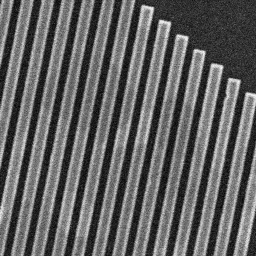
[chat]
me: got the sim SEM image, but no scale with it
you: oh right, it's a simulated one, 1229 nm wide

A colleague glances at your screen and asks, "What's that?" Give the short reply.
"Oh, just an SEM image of parallel lines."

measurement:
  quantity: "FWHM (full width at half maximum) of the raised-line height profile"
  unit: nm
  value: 49.4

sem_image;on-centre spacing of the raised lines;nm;95.1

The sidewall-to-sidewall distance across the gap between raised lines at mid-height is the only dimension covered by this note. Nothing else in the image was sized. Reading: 49.4 nanometres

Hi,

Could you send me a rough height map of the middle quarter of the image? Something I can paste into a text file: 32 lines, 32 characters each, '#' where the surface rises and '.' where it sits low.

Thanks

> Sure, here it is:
..##...##...##...##...##...##...
.###..###..###...##...##...##...
.###..###..###..###..###...##...
.##...###..###..###..###..###..#
.##...##...##...##...##...##...#
.##...##...##...##...##...##...#
###..###...##...##...##...##...#
###..###..###..###...##..###...#
##...###..###..###..###..###..##
##...##...##...##...##...##...##
##...##...##...##...##...##...##
##..###...##...##...##...##...##
##..###..###..###...##..###...##
##..##...###..###..###..###..###
#...##...##...##...##...##...###
#...##...##...##...##...##...##.
#..###...##...##...##...##...##.
#..###..###..###...##...##...##.
...###..###..###..###..###..###.
...##...##...##...##...##...###.
...##...##...##...##...##...##..
..###...##...##...##...##...##..
..###..###..###...##..###...##..
..###..###..###..###..###..###..
..##...##...##...##...###..###..
..##...##...##...##...##...##...
.###...##...##...##...##...##...
.###..###..###...##..###...##...
.###..###..###..###..###..###..#
.##...##...##...##...###..###..#
.##...##...##...##...##...##...#
###...##...##...##...##...##...#